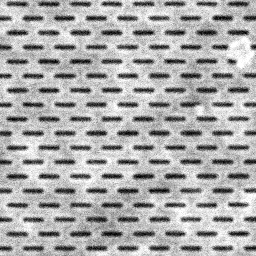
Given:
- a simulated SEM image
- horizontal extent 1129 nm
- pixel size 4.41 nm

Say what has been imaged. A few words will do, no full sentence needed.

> a regular array of holes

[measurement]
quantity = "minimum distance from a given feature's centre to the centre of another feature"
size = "92.4 nm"